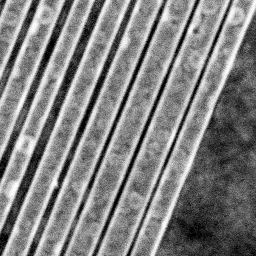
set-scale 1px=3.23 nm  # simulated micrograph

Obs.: parallel lines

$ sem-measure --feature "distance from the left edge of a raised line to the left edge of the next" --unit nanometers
96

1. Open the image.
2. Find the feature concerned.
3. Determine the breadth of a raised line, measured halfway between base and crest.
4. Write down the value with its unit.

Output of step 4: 21.2 pixels